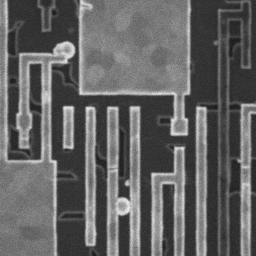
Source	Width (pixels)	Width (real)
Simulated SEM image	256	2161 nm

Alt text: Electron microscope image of wiring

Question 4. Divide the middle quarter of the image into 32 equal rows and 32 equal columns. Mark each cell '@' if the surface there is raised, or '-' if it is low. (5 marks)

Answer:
----@@@@@@@@@@@@@@@@@@@@@@@@@@@-
----@@@@@@@@@@@@@@@@@@@@@@@@@@@-
----@@@@@@@@@@@@@@@@@@@@@@@@@@@-
----@@@@@@@@@@@@@@@@@@@@@@@@@@@-
----@@@@@@@@@@@@@@@@@@@@@@@@@@@-
----@@@@@@@@@@@@@@@@@@@@@@@@@@@-
----@@@@@@@@@@@@@@@@@@@@@@@@@@@-
----@@@@@@@@@------@@@@@@@@@@@@-
----------------------------@@--
----------------------------@@--
----------------------------@@--
@@----@@---@@----@@---------@@--
@@----@@---@@----@@---------@@--
@@----@@---@@----@@---------@@--
@@----@@---@@----@@--------@@@@-
@@----@@---@@----@@--------@@@@-
@@----@@---@@----@@--------@@@@-
@@----@@---@@----@@--------@@@@-
@@----@@---@@----@@-------------
@@----@@---@@----@@-------------
@@----@@---@@----@@-------------
------@@---@@----@@---------@@--
------@@---@@----@@---------@@--
------@@---@@----@@---------@@--
------@@---@@----@@---------@@--
------@@---@@----@@---------@@--
------@@----@----@@---------@@--
------@@---@@----@@--------@@@--
------@@---@@----@@---@@@@@@@@--
------@@---@@----@@---@@@@@@@@--
------@@---@@----@@---@@----@@--
------@@---@@----@@---@@----@@--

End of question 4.